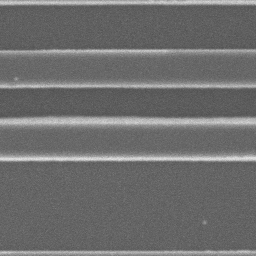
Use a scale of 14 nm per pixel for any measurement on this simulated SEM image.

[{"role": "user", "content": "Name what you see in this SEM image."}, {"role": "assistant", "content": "lines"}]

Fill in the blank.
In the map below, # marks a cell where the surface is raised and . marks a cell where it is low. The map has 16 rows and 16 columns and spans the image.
................
................
................
################
################
................
................
................
################
################
................
................
................
................
................
................